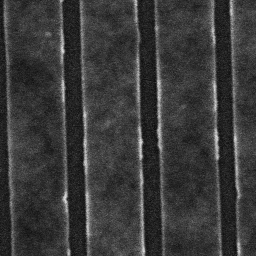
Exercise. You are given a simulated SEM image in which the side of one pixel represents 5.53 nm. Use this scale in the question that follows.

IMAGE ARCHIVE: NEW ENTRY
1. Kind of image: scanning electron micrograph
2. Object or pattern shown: one or a few lines or trenches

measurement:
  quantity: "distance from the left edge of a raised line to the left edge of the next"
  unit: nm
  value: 418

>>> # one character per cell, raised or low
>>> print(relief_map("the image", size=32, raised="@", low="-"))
-@@@@@@@--@@@@@@@--@@@@@@@@--@@@
-@@@@@@@--@@@@@@@--@@@@@@@@--@@@
-@@@@@@@--@@@@@@@--@@@@@@@@--@@@
-@@@@@@@--@@@@@@@--@@@@@@@@--@@@
-@@@@@@@--@@@@@@@---@@@@@@@--@@@
-@@@@@@@--@@@@@@@---@@@@@@@--@@@
-@@@@@@@--@@@@@@@---@@@@@@@--@@@
-@@@@@@@--@@@@@@@---@@@@@@@--@@@
-@@@@@@@--@@@@@@@---@@@@@@@--@@@
-@@@@@@@--@@@@@@@---@@@@@@@--@@@
-@@@@@@@--@@@@@@@---@@@@@@@--@@@
-@@@@@@@--@@@@@@@---@@@@@@@--@@@
-@@@@@@@--@@@@@@@---@@@@@@@--@@@
-@@@@@@@--@@@@@@@---@@@@@@@---@@
-@@@@@@@---@@@@@@---@@@@@@@--@@@
-@@@@@@@---@@@@@@---@@@@@@@--@@@
-@@@@@@@---@@@@@@@--@@@@@@@--@@@
-@@@@@@@--@@@@@@@@--@@@@@@@--@@@
-@@@@@@@--@@@@@@@@--@@@@@@@--@@@
-@@@@@@@---@@@@@@@--@@@@@@@--@@@
-@@@@@@@---@@@@@@@--@@@@@@@--@@@
-@@@@@@@---@@@@@@@--@@@@@@@---@@
-@@@@@@@---@@@@@@@--@@@@@@@---@@
-@@@@@@@---@@@@@@@--@@@@@@@---@@
-@@@@@@@---@@@@@@@--@@@@@@@---@@
-@@@@@@@---@@@@@@@--@@@@@@@---@@
-@@@@@@@---@@@@@@@--@@@@@@@---@@
-@@@@@@@---@@@@@@@--@@@@@@@---@@
--@@@@@@@--@@@@@@@--@@@@@@@---@@
--@@@@@@---@@@@@@@--@@@@@@@@--@@
--@@@@@@@--@@@@@@@--@@@@@@@@--@@
--@@@@@@@--@@@@@@@--@@@@@@@@--@@